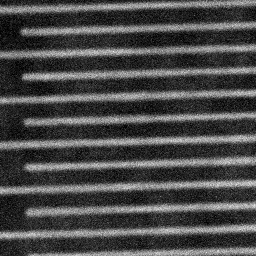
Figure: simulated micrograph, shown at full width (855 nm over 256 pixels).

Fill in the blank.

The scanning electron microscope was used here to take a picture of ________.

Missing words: parallel lines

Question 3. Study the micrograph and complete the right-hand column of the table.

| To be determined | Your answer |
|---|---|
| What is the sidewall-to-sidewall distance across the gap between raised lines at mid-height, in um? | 0.0577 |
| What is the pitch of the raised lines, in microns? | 0.0755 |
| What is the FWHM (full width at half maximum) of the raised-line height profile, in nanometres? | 17.1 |